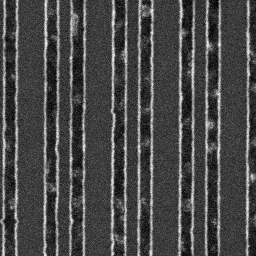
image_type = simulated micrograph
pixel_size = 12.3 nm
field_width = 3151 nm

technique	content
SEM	parallel lines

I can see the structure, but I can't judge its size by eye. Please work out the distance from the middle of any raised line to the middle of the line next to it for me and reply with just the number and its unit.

416 nanometres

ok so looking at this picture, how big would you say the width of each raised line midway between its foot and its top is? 0.162 micrometres